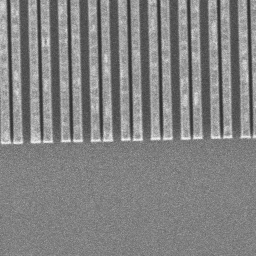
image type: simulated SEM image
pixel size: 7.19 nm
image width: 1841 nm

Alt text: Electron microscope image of parallel lines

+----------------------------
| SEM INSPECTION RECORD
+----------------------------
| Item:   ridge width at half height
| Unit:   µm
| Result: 0.0602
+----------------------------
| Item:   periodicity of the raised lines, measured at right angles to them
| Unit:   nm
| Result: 109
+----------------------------